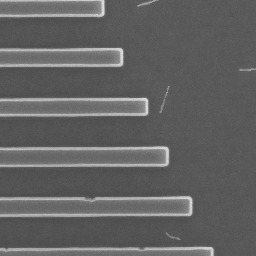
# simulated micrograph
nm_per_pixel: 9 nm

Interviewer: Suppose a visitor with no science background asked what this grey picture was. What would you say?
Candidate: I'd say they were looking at parallel lines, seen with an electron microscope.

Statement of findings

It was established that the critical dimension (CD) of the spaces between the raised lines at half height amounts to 33.6 px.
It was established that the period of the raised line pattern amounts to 448 nanometres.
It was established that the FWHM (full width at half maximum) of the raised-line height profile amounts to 0.147 microns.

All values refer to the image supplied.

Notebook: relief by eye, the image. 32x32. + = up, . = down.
+++++++++++++...................
+++++++++++++...................
................................
................................
................................
................................
+++++++++++++++.................
+++++++++++++++.................
................................
................................
................................
................................
......++++++++++++..............
++++++++++++++++++..............
................................
................................
................................
................................
.................++++...........
+++++++++++++++++++++...........
+++++++++++++++++++++...........
................................
................................
................................
................................
++++++++++++++++++++++++........
++++++++++++++++++++++++........
................................
................................
................................
................................
++++++++++++++++++++++++++......